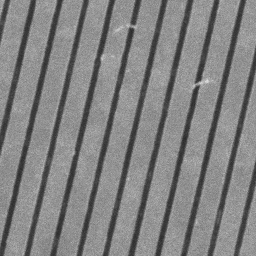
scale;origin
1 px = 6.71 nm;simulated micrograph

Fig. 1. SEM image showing parallel lines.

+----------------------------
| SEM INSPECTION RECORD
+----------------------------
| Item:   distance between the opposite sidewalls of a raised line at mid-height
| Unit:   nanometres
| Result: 130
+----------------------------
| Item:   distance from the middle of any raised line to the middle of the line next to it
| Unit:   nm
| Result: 171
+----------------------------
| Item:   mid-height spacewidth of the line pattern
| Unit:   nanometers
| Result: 44.9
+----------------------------